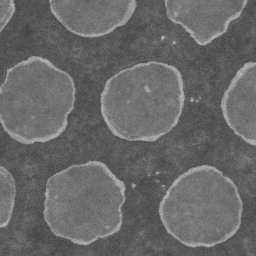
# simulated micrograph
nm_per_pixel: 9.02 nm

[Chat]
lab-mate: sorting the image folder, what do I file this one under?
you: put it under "raised bodies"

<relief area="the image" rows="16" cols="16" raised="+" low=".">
+..+++++..+++++.
....++++...+++..
............+...
................
.+++....+++....+
+++++..++++...++
+++++.+++++...++
++++...++++...++
.++.....++.....+
................
....+++.....+...
+..++++....++++.
+..+++++..+++++.
+..+++++..+++++.
...++++....++++.
................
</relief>